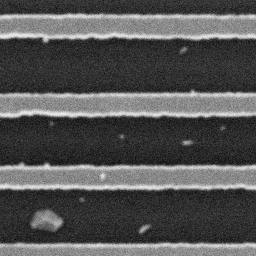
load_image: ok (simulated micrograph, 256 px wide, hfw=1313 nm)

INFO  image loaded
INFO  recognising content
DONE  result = lines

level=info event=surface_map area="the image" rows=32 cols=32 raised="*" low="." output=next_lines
................................
................................
********************************
********************************
********************************
................................
................................
................................
................................
................................
................................
................................
********************************
********************************
**.........*....................
................................
................................
................................
................................
................................
................................
********************************
********************************
...........****...***....**....*
................................
................................
................................
................................
................................
................................
................................
********************************